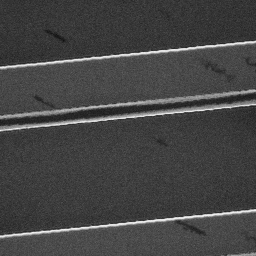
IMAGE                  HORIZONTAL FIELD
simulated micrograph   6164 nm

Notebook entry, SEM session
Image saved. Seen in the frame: lines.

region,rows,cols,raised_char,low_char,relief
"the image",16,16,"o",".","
................
................
................
.......ooooooooo
oooooooooooooooo
oooooooooooooooo
oooooooooooooooo
oooooo..........
................
................
................
................
................
............oooo
...ooooooooooooo
oooooooooooooooo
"